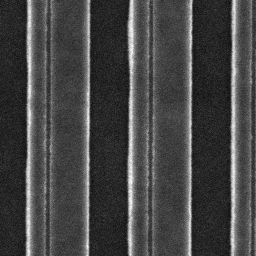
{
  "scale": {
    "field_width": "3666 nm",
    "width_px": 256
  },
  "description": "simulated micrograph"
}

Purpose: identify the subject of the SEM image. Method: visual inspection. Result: lines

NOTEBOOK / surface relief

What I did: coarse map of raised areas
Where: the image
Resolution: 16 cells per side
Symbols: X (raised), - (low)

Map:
--XXXX--XXXX---X
--XXXX--XXXX---X
--XXXX--XXXX---X
--XXXX--XXXX---X
--XXXX--XXXX---X
--XXXX--XXXX---X
--XXXX--XXXX---X
--XXXX--XXXX---X
--XXXX--XXXX---X
--XXXX--XXXX---X
--XXX---XXXX---X
--XXX---XXXX---X
--XXX---XXXX---X
--XXX---XXXX---X
--XXX---XXXX---X
--XXX---XXXX---X